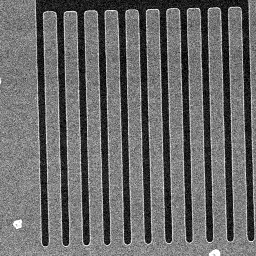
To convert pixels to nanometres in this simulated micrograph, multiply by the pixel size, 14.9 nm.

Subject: groups of lines, slits or small figures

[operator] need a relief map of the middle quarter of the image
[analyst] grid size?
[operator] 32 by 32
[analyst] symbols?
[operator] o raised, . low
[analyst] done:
ooo...ooo..ooo..ooo..ooo..ooo..o
ooo...ooo..ooo..ooo..ooo..ooo..o
oooo..ooo..ooo..ooo..ooo..ooo..o
oooo..ooo..ooo..ooo..ooo..ooo..o
oooo..ooo..ooo..ooo..ooo..ooo..o
oooo..ooo..ooo..ooo..ooo..ooo..o
oooo..ooo..ooo..ooo..ooo..ooo..o
.ooo..ooo..ooo..ooo..ooo..ooo..o
.ooo..ooo..ooo..ooo..ooo..ooo..o
.ooo..ooo..ooo..ooo..ooo..ooo..o
.ooo..ooo..ooo..ooo..ooo..ooo...
.ooo..ooo..ooo..ooo..ooo..ooo...
.ooo..ooo..ooo..ooo..ooo..ooo...
.ooo..ooo..ooo..ooo..ooo..ooo...
.ooo..ooo..ooo..ooo..ooo..oooo..
.ooo..ooo..ooo..ooo..ooo...ooo..
.ooo..ooo..ooo..ooo..ooo...ooo..
.ooo..ooo..ooo..ooo..ooo...ooo..
.ooo..ooo..ooo..ooo..oooo..ooo..
.ooo..ooo..ooo..ooo..oooo..ooo..
.ooo..ooo..ooo..ooo...ooo..ooo..
.ooo..ooo..ooo..ooo...ooo..ooo..
.ooo..ooo..ooo..ooo...ooo..ooo..
.ooo..ooo..ooo..ooo...ooo..ooo..
.ooo..ooo..ooo..ooo...ooo..ooo..
.ooo..ooo..ooo..ooo...ooo..ooo..
.ooo..ooo..ooo..oooo..ooo..ooo..
.ooo..ooo..ooo..oooo..ooo..ooo..
.ooo..ooo..oooo.oooo..ooo..ooo..
.ooo..ooo..oooo.oooo..ooo..ooo..
.ooo..ooo..oooo..ooo..ooo..ooo..
.ooo..ooo..oooo..ooo..ooo..ooo..